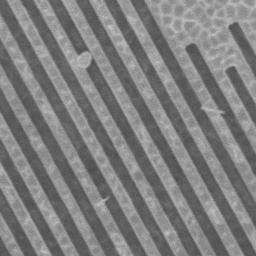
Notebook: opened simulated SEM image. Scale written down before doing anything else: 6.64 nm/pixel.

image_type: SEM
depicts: parallel lines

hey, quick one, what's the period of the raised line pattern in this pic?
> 24 pixels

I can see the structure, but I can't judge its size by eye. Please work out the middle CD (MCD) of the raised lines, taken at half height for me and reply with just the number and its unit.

70.6 nanometers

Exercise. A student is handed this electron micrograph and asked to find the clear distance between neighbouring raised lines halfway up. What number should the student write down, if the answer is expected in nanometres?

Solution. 89.4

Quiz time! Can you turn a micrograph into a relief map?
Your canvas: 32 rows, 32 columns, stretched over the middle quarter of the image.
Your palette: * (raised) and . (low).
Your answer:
..****...***...****....**....***
..***....***....***....***....**
...***....***...****....***...**
...***....***....***....***....*
....***....***....***....***...*
*...****....**....***....***....
*....***....***....***....***...
**....***....***...***....***...
**....***....***....***....***..
***....***....***...****...***..
.**....***....***....***....***.
.***....***....***...****....***
..***...***....***....***....***
..***....***....***....***....**
...***...****....**....***....**
...***....***....***....***....*
....***...****....***...***....*
....***....***....***....***....
*....***....***....***...****...
**....**....***....***....***...
**....***....***....***...****..
***....***...***....***....***..
***....***....***....***....***.
.***....***...****...***....***.
.***....***....***....***....***
..***....***...****....**....***
...**....***....***....***....**
...***....***....***....***...**
....***....**....***....***....*
....***....***....***....***...*
*....***....***...***....***....
*....***....***....***....***...